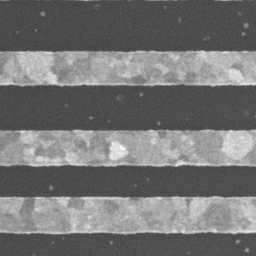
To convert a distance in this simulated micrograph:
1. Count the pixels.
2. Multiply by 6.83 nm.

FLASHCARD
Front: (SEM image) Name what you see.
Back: lines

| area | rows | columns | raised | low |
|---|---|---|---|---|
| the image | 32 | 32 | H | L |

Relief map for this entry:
LLLLLLLLLLLLLLLLLLLLLLLLLLLLLLLL
LLLLLLLLLLLLLLLLLLLLLLLLLLLLLLLL
LLLLLLLLLLLLLLLLLLLLLLLLLLLLLLLL
LLLLLLLLLLLLLLLLLLLLLLLLLLLLLLLL
LLLLLLLLLLLLLLLLLLLLLLLLLLLLLLLL
LLLLLLLLLLLLLLLLLLLLLLLLLLLLLLLL
LLLLLLLLLLLLHLLLLHHHLLLHHHLLLLHL
HHHHHHHHHHHHHHHHHHHHHHHHHHHHHHHH
HHHHHHHHHHHHHHHHHHHHHHHHHHHHHHHH
HHHHHHHHHHHHHHHHHHHHHHHHHHHHHHHH
HLHHHHLHHHHLHHHHHHHHHLLLHHHHLHHH
LLLLLLLLLLLLLLLLLLLLLLLLLLLLLLLL
LLLLLLLLLLLLLLLLLLLLLLLLLLLLLLLL
LLLLLLLLLLLLLLLLLLLLLLLLLLLLLLLL
LLLLLLLLLLLLLLLLLLLLLLLLLLLLLLLL
LLLLLLLLLLLLLLLLLLLLLLLLLLLLLLLL
HHHHHHHHHHHHHHHHHHHHHHHHHHHHHHHH
HHHHHHHHHHHHHHHHHHHHHHHHHHHHHHHH
HHHHHHHHHHHHHHHHHHHHHHHHHHHHHHHH
HHHHHHHHHHHHHHHHHHHHHHHHHHHHHHHH
HHHHHHHHHHHHHHHHHHHHHHHHHHHHHHHH
LLLLLLLLLLLLLLLLLLLLLLLLLLLLLLLL
LLLLLLLLLLLLLLLLLLLLLLLLLLLLLLLL
LLLLLLLLLLLLLLLLLLLLLLLLLLLLLLLL
LLLLLLLLLLLLLLLLLLLLLLLLLLLLLLLL
HHHHHHHHHHHHHHHHHHHHHHHHHHHHHHHH
HHHHHHHHHHHHHHHHHHHHHHHHHHHHHHHH
HHHHHHHHHHHHHHHHHHHHHHHHHHHHHHHH
HHHHHHHHHHHHHHHHHHHHHHHHHHHHHHHH
LLLLLLLLLLLLLLLLLLLLLLLLLLLLLLLL
LLLLLLLLLLLLLLLLLLLLLLLLLLLLLLLL
LLLLLLLLLLLLLLLLLLLLLLLLLLLLLLLL